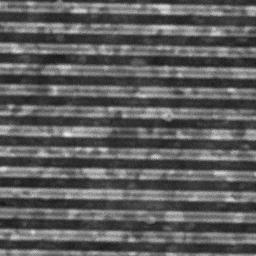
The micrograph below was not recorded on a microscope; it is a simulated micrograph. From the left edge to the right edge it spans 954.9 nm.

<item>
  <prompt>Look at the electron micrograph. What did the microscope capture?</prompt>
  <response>parallel lines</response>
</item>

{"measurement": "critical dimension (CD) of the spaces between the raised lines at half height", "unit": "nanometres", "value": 51.3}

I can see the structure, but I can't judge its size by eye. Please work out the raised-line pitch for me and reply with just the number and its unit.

77.2 nm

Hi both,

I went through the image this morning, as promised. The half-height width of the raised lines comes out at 25.7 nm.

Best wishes